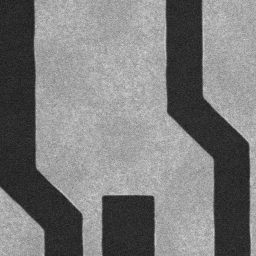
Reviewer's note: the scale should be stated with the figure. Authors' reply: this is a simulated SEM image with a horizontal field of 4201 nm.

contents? groups of lines, slits or small figures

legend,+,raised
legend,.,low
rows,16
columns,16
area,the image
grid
..++++++++...+++
..++++++++...+++
..++++++++...+++
..++++++++...+++
..++++++++...+++
..++++++++...+++
..++++++++...+++
..+++++++++...++
..++++++++++...+
..+++++++++++...
..+++++++++++...
...++++++++++...
+...++....+++...
++...+....+++...
+++..+....+++...
+++..+....+++...